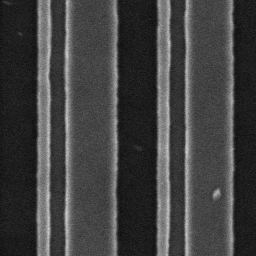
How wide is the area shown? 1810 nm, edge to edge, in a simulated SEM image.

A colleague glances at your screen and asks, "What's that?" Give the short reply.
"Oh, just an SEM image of lines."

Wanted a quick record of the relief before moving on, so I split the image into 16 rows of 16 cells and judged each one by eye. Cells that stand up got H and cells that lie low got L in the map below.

LLHHHHHLLLHHHHLL
LLHHHHHLLLHHHHHL
LLHHHHHLLLHHHHLL
LLHHHHHLLLHHHHHL
LLHHHHHLLLHHHHHL
LLHHHHHLLLHHHHHL
LLHHHHHLLLHHHHHL
LLHHHHHLLLHHHHLL
LLHHHHHLLLHHHHLL
LLHHHHHLLLHHHHHL
LLHHHHHLLLHHHHHL
LLHHHHHLLLHHHHLL
LLHHHHHLLLHHHHHL
LLHHHHHLLLHHHHLL
LLHHHHHLLLHHHHLL
LLHHHHHLLLHHHHLL